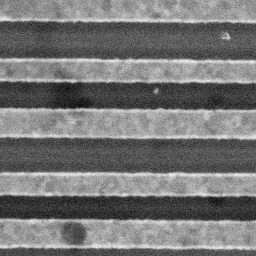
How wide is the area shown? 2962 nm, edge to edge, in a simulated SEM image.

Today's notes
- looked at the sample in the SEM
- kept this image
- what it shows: lines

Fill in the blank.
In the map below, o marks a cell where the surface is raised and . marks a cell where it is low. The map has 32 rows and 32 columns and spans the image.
oooooooooooooooooooooooooooooooo
oooooooooooooooooooooooooooooooo
oooooooooooooooooooooooooooooooo
................................
................................
................................
................................
ooooooo.ooo.....................
oooooooooooooooooooooooooooooooo
oooooooooooooooooooooooooooooooo
................................
................................
................................
................................
oooooooooooooooooooooooooooooooo
oooooooooooooooooooooooooooooooo
oooooooooooooooooooooooooooooooo
................................
................................
................................
................................
................................
oooooooooooooooooooooooooooooooo
oooooooooooooooooooooooooooooooo
...............o......o....o...o
................................
................................
ooo.o...........................
oooooooooooooooooooooooooooooooo
oooooooooooooooooooooooooooooooo
oooooooooooooooooooooooooooooooo
................................